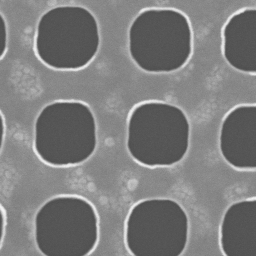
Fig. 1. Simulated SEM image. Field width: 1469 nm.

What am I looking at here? holes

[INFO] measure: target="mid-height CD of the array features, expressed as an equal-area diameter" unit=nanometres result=367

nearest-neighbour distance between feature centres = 532 nanometers